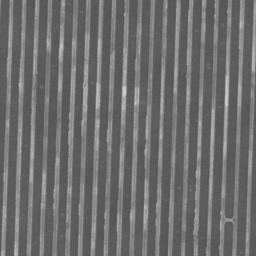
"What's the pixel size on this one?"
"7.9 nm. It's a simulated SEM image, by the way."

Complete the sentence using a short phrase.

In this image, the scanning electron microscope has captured parallel lines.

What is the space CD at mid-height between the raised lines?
73 nm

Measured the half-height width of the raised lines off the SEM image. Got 28.6 nm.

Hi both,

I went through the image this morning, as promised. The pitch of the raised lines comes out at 0.101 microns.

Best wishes